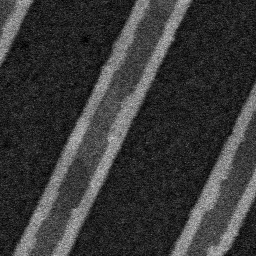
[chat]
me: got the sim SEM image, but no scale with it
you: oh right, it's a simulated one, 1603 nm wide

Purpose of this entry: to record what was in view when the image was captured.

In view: one or a few lines or trenches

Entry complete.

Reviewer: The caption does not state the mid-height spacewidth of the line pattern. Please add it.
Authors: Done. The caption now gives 668 nanometres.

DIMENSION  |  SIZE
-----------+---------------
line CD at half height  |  228 nanometres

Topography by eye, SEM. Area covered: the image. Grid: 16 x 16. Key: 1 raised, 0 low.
1000000001100000
1000000011100000
0000000011000000
0000000111000000
0000000110000000
0000001110000000
0000001100000000
0000011100000001
0000011000000001
0000111000000011
0000110000000011
0001110000000111
0001100000000110
0011100000001110
0011000000001100
0111000000011100